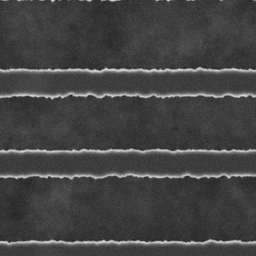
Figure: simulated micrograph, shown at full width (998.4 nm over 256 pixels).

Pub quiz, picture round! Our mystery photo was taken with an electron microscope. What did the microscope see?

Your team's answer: lines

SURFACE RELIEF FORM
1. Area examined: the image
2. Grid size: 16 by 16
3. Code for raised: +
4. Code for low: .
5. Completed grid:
................
................
................
................
++++++++++++++++
++++++++++++++++
................
................
................
++++++++++++++++
++++++++++++++++
................
................
................
................
++++++++++++++++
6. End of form